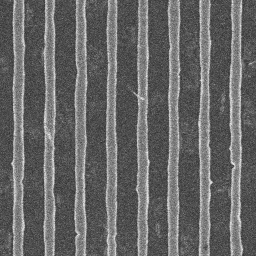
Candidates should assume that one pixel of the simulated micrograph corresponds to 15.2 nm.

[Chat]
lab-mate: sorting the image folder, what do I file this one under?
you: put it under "parallel lines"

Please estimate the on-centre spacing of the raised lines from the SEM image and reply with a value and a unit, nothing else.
472 nanometres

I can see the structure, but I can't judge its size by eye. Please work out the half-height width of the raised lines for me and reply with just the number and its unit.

150 nm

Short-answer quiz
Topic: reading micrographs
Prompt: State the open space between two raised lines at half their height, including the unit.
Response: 329 nm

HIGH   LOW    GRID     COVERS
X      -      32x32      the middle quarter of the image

---XXX-----XX-----XXX------XX---
----XX-----XX-----XXX------XX---
---XXX-----XX------XX------XX---
---XXX-----XX------XX-----XXX---
---XXX-----XX------XX-----XXX---
---XXX-----XX------XX-----XXX---
---XXX-----XX------XX-----XXX---
---XXX-----XX-----XXX-----XXX---
---XXX-----XX-----XXX-----XX----
---XXX-----XX------XX-----XX----
---XX------XX------XX-----XX----
---XX------XX------XX-----XX----
---XX------XX------XX-----XX----
---XX------XX------XX-----XXX---
---XX------XX-----XXX------XX---
---XX------XX-----XXX------XX---
---XX------XX-----XXX------XX---
---XX------XX-----XXX------XX---
---XX------XX-----XXX-----XXX---
---XX------XX-----XXX-----XXX---
---XX------XX-----XXX------XX---
---XX------XX------XX------XX---
---XX------XX------XX-----XXX---
---XX------XX------XX-----XXX---
---XX------XX------XX-----XXX---
---XX------XX------XX-----XX----
---XX------XX------XX-----XX----
---XX------XX-----XXX-----XX----
---XX------XX-----XXX-----XX----
---XX------XX-----XXX-----XX----
---XX------XX-----XXX-----XXX---
---XX------XX-----XXX-----XXX---